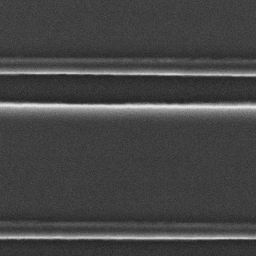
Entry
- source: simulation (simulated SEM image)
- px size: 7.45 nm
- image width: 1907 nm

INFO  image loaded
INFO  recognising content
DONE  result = lines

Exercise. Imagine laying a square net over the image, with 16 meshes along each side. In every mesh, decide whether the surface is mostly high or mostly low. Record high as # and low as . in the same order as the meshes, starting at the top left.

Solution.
################
################
################
################
################
................
................
################
################
################
################
################
################
################
################
................